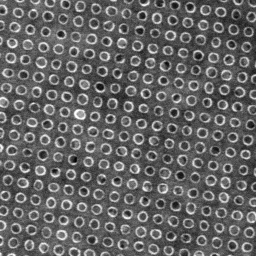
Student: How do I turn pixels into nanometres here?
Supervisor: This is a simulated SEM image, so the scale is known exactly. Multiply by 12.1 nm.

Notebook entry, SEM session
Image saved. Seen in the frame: a regular array of raised bodies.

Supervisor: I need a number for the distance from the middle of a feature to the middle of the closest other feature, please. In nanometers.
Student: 182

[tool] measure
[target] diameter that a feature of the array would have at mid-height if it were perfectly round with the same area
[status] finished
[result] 109 nm